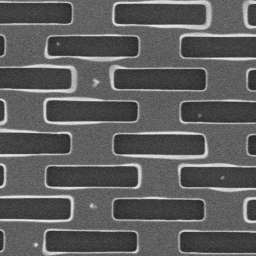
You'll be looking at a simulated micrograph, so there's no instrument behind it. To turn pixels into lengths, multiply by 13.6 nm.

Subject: groups of lines, slits or small figures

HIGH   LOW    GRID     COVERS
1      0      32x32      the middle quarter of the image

11111111111111111111111111111111
00111111111100000000000000000000
00111111111100000000000000000000
00111111111100000000000000000000
00111111111100000000000000000000
00111111111100000000000000000000
00111111111111000000000000000000
11111111111111111111111111111111
11111111111111111111111111111111
00000000000000000011111111111100
00000000000000000001111111111000
00000000000000000001111111111000
00000000000000000001111111111000
00000000000000000001111111111000
00000000111111111111111111111100
11111111111111111111111111111111
11111111111111111111111111111111
01111111111110000000000000000000
00111111111100000000000000000000
00111111111100000000000000000000
00111111111100000000000000000000
00111111111100000000000000000000
01111111111110000000000000000000
11111111111111111111111111111111
11111111111111111111111111111111
00000000000000000011111111111100
00000000000000000001111111111000
00000000000000000001111111111000
00000000000000000001111111111000
00000000000000000001111111111000
00000000000000000011111111111000
11111111111111111111111111111111